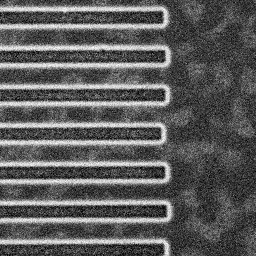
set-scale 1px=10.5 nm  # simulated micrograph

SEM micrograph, parallel lines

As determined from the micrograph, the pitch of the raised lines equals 0.407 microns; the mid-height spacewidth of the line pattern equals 176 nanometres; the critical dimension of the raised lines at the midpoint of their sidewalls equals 0.238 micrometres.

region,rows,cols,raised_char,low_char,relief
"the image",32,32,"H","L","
HHHHHHHHHHHHHHHHHHHHHHHHHHHHHHHH
LLLLLLLLLLLLLLLLLLLLHHHHHHHHHHHH
LLLLLLLLLLLLLLLLLLLLLHHHHHHHHHHH
HHHHHHHHHHHHHHHHHHHHHHHHHHHHHHHH
HHHHHHHHHHHHHHHHHHHHHHHHHHHHHHHH
HHHHHHHHHHHHHHHHHHHHHHHHHHHHHHHH
LLLLLLLLLLLLLLLLLLLLLHHHHHHHHHHH
LLLLLLLLLLLLLLLLLLLLLHHHHHHHHHHH
HHHHHHHHHHHHHHHHHHHHHHHHHHHHHHHH
HHHHHHHHHHHHHHHHHHHHHHHHHHHHHHHH
HHHHHHHHHHHHHHHHHHHHHHHHHHHHHHHH
LLLLLLLLLLLLLLLLLLLLLHHHHHHHHHHH
LLLLLLLLLLLLLLLLLLLLLHHHHHHHHHHH
HHHHHHHHHHHHHHHHHHHHHHHHHHHHHHHH
HHHHHHHHHHHHHHHHHHHHHHHHHHHHHHHH
HHHHHHHHHHHHHHHHHHHHHHHHHHHHHHHH
LLLLLLLLLLLLLLLLLLLLHHHHHHHHHHHH
LLLLLLLLLLLLLLLLLLLLHHHHHHHHHHHH
HHHHHHHHHHHHHHHHHHHHHHHHHHHHHHHH
HHHHHHHHHHHHHHHHHHHHHHHHHHHHHHHH
LLLLLLLLLHHHHHLLHHHHHHHHHHHHHHHH
LLLLLLLLLLLLLLLLLLLLLHHHHHHHHHHH
LLLLLLLLLLLLLLLLLLLLLHHHHHHHHHHH
HHHHHHHHHHHHHHHHHHHHHHHHHHHHHHHH
HHHHHHHHHHHHHHHHHHHHHHHHHHHHHHHH
LLLLLLLLLLLLLLLLLLLLLHHHHHHHHHHH
LLLLLLLLLLLLLLLLLLLLLHHHHHHHHHHH
LLHLLLHHLLLLLLLLLLLLHHHHHHHHHHHH
HHHHHHHHHHHHHHHHHHHHHHHHHHHHHHHH
HHHHHHHHHHHHHHHHHHHHHHHHHHHHHHHH
LLLLLLLLLLLLLLLLLLLLLHHHHHHHHHHH
LLLLLLLLLLLLLLLLLLLLLHHHHHHHHHHH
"